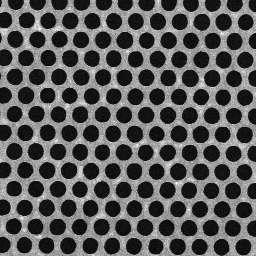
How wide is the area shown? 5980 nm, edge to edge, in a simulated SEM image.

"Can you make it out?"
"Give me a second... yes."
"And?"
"a regular array of holes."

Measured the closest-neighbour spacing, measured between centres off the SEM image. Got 0.499 microns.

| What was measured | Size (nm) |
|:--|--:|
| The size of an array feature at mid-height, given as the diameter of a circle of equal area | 386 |